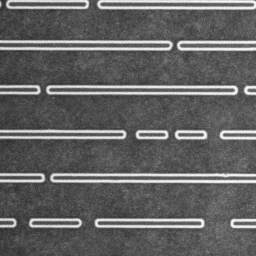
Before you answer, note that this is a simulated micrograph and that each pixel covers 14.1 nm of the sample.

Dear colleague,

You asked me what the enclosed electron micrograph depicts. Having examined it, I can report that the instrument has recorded parallel lines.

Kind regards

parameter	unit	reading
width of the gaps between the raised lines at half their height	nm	533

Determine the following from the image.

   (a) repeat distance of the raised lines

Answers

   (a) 618 nanometers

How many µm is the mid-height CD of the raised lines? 0.0971